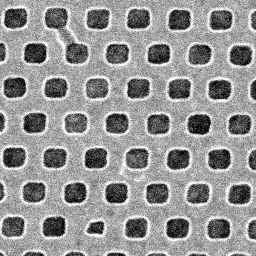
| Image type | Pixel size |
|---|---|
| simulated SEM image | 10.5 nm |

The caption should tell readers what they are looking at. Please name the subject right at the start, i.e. a regular array of holes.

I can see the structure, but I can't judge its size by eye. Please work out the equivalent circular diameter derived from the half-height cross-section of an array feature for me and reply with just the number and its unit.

251 nanometers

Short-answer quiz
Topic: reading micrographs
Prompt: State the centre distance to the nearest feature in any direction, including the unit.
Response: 423 nanometers